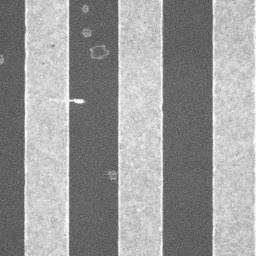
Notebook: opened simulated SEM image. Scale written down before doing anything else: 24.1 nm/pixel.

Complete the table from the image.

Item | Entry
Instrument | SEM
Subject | one or a few lines or trenches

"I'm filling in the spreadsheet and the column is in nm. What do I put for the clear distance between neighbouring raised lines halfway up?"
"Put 1240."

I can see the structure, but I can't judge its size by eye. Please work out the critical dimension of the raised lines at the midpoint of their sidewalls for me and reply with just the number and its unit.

1010 nm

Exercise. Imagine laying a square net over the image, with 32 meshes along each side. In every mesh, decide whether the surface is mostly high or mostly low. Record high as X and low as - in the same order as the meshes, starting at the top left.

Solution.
---XXXXX-------XXXXX-------XXXXX
---XXXXX-------XXXXX-------XXXXX
---XXXXX-------XXXXX-------XXX--
---XXXXX-------XXXXX-------XXXXX
---XXXX--------XXX-X-------XX-XX
---XX----------X--XX-------XXXXX
---XX----------XXXXX-------XXXXX
---XX-X--------XXXXX-------X-XXX
---XX-XX-------XXXXX-------XXXXX
---XXXXX-------XXXXX-------XXXX-
---XXXXX-------XXXXX-------XXXX-
---XXXXX-------XXXXX-------XXXXX
---XXX-XX------XXXXX-------XXXXX
---XX----------XXXXX-------XXXXX
---XX--X-------XXXXX-------XXXXX
---XXX-X-------XXXXX-------XXXXX
---XXXXX-------XXXXX-------XXXXX
---XXXXX-------XXXXX-------XXXXX
---XXXXX-------XXXXX-------XXXXX
---XXXXX-------XXXXX-------XXXXX
---XXXXX-------XXXX--------XXXXX
---XXXXX-------XXXXX-------XXXXX
---XXXXX-------XXXXX-------XXXXX
---XXXXX-------XXXXX-------XXXXX
---XXXXX-------XXXXX-------XXXXX
---XXXXX-------XXXXX-------XXXXX
---XXXXX-------XXXXX-------XXXXX
---XXXXX-------XXXXX-------XXXXX
---XXXXX-------XXXXX-------XX-XX
---XXXXX-------X-XXX-------X--XX
---XXXXX-------X-XXX-------XXXXX
---XXXXX-------XXXXX-------XXXXX